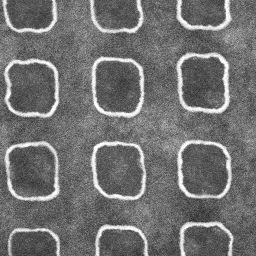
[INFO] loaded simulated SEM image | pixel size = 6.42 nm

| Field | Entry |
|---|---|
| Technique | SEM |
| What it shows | raised bodies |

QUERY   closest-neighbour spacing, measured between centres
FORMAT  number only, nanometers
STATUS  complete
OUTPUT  537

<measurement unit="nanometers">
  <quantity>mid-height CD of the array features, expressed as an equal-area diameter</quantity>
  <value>373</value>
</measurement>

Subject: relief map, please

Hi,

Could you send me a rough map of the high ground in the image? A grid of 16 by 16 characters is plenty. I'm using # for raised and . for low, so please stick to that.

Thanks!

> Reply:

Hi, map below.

###...###..###..
.##...###...##..
................
............##..
###...###..###..
####..###..###..
####..###..###..
................
................
.##...###..###..
####..###..###..
.###..###..###..
................
................
.##...###..###..
.###..###..###..